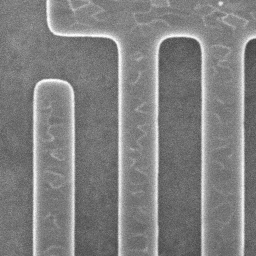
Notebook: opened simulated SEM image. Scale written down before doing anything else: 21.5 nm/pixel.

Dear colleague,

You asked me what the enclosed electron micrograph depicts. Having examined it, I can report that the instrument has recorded wiring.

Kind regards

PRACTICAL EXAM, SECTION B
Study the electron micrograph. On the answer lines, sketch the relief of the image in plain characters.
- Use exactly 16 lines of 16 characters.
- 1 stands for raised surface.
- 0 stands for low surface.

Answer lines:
0001111111111111
0001111111111111
0000000111001111
0000000111000110
0000000111000110
0011000111000110
0011100111000110
0011100111000110
0011100111000110
0011100111000110
0011100111000110
0011100111000110
0011100111000110
0011100111000110
0011100111000110
0011100111000110